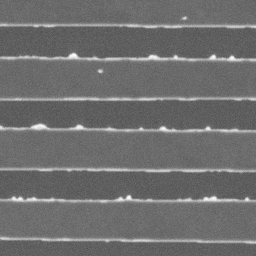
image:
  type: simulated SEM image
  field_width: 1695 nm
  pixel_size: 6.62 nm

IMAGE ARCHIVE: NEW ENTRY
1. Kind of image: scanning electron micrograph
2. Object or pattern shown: lines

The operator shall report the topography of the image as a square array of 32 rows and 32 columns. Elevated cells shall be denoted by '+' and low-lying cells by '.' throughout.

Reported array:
++++++++++++++++++++++++++++++++
++++++++++++++++++++++++++++++++
++++++++++++++++++++++++++++++++
................................
................................
................................
................................
++++++++++++++++++++++++++++++++
++++++++++++++++++++++++++++++++
++++++++++++++++++++++++++++++++
++++++++++++++++++++++++++++++++
++++++++++++++++++++++++++++++++
................................
................................
................................
................................
++++++++++++++++++++++++++++++++
++++++++++++++++++++++++++++++++
++++++++++++++++++++++++++++++++
++++++++++++++++++++++++++++++++
++++++++++++++++++++++++++++++++
................................
................................
................................
................................
++++++++++++++++++++++++++++++++
++++++++++++++++++++++++++++++++
++++++++++++++++++++++++++++++++
++++++++++++++++++++++++++++++++
++++++++++++++++++++++++++++++++
................................
................................